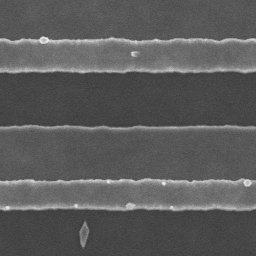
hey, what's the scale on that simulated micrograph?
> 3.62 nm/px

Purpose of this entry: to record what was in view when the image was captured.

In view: lines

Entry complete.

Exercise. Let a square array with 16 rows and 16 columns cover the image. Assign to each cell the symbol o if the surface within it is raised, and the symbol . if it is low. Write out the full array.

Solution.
oooooooooooooooo
oooooooooooooooo
oooooooooooooooo
oooooooooooooooo
................
................
................
................
oooooooooooooooo
oooooooooooooooo
oooooooooooooooo
oooooooooooooooo
oooooooooooooooo
................
................
................